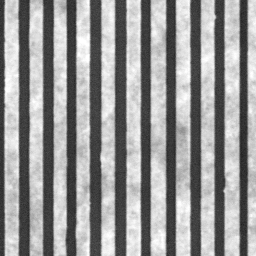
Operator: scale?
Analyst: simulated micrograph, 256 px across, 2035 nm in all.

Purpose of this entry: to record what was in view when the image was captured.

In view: parallel lines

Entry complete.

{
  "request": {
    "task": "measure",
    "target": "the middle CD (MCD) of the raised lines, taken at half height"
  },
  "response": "0.103 µm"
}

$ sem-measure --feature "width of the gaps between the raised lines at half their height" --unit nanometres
89.5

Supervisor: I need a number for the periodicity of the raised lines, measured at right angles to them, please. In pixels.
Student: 24.5